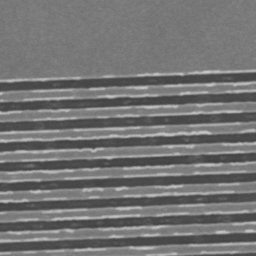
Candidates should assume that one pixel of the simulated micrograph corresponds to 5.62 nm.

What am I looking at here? parallel lines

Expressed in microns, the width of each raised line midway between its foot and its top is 0.0611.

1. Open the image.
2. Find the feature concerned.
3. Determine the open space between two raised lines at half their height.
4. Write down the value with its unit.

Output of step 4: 49.9 nm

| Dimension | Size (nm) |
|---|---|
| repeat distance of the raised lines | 113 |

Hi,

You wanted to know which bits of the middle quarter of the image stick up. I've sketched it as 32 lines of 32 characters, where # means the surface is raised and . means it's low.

################################
################################
###############################.
######..........................
................................
...................###.#########
################################
################################
##########......................
................................
................##.#..##########
################################
################################
#########.......................
................................
........................########
.###############################
################################
############....................
................................
........................########
################################
################################
############....................
................................
......................##########
################################
################################
#########.......................
................................
.....................###...#####
################################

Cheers